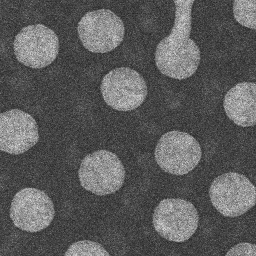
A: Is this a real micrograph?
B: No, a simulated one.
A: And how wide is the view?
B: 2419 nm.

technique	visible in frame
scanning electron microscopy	raised bodies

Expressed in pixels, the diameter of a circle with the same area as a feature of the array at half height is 44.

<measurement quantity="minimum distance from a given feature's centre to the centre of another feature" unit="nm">630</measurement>